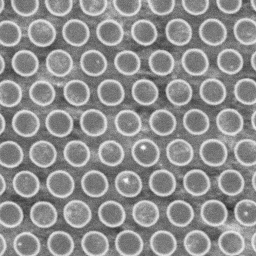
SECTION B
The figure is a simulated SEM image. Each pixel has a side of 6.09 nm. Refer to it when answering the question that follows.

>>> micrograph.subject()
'a regular array of raised bodies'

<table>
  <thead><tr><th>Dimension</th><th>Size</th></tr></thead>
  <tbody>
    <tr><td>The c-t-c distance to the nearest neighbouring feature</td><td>206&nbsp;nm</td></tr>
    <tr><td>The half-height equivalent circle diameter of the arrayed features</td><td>151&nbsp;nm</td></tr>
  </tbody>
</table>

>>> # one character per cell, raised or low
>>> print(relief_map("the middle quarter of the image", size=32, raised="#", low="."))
##..######...######...#####...##
#....#####....####....#####....#
......###..............##.......
................................
..##......###......###.....###..
.#####...#####....#####...#####.
######...######..######...######
######...######..######...######
.#####...######...#####...#####.
.####.....####.....###.....####.
................................
................................
#....####.....####....#####....#
##..######...######...######..##
##..######...######...######..##
##..######...######...######..##
##...#####....#####...#####....#
#.....###......##.......##......
................................
..##..............####.....###..
.####....#####....#####...######
######...#####...######...######
######...######..#######..######
######...#####....#####...######
.####.....####....#####....####.
................................
................................
#.....###.....####....#####....#
##...#####...######...#####...##
##...######..######...######..##
##...######..######...######..##
##...######..######...#####....#